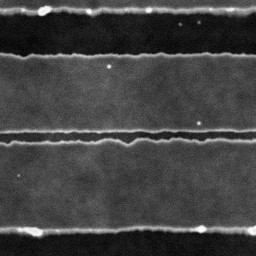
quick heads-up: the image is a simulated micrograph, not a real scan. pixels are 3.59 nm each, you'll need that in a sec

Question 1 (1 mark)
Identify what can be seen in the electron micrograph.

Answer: lines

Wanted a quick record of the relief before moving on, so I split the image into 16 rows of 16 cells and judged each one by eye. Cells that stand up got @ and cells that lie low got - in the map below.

@@@@@@@@@@@@@@@@
----------------
----------------
@-@@@@@@@@@@@@@@
@@@@@@@@@@@@@@@@
@@@@@@@@@@@@@@@@
@@@@@@@@@@@@@@@@
@@@@@@@@@@@@@@@@
@@@@@@@@@@@@@@@@
@@@@@@@@@@@@@@@@
@@@@@@@@@@@@@@@@
@@@@@@@@@@@@@@@@
@@@@@@@@@@@@@@@@
@@@@@@@@@@@@@@@@
--@-------------
----------------